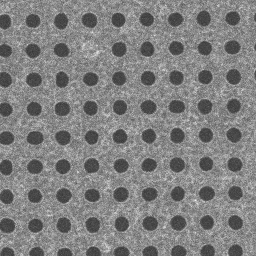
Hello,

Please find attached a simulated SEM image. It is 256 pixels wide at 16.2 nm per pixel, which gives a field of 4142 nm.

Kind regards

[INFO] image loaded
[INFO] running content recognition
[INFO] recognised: a regular array of holes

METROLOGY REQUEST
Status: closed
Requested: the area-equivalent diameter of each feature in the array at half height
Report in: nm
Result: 247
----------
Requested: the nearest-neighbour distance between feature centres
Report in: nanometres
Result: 457